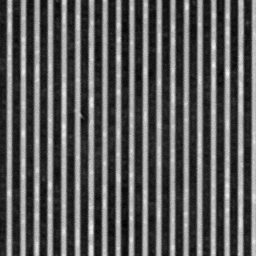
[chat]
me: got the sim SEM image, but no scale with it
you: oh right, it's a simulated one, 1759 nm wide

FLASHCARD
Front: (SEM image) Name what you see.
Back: parallel lines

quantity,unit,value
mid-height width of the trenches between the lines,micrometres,0.0593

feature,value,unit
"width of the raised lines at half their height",36.1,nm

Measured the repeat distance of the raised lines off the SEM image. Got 0.0935 µm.